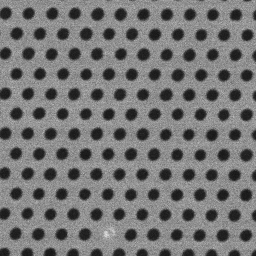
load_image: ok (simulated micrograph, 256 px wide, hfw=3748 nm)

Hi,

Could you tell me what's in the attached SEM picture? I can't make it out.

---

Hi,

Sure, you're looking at a regular array of holes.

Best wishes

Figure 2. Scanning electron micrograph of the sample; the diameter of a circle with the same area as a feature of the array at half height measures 180 nanometers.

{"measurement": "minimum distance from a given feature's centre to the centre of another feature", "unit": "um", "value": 0.333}